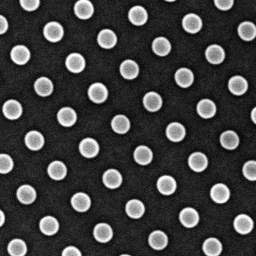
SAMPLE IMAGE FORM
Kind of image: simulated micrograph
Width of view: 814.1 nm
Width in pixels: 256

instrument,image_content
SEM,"a regular array of raised bodies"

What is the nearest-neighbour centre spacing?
121 nm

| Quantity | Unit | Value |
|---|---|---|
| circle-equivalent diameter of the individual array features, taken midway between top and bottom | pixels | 17.8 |